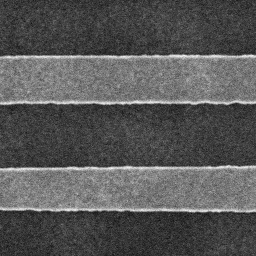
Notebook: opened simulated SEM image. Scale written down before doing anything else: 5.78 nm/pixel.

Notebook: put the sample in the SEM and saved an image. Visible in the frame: lines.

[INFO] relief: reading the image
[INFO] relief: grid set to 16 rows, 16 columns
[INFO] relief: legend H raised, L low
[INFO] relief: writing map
LLLLLLLLLLLLLLLL
LLLLLLLLLLLLLLLL
LLLLLLLLLLLLLLLL
LLLLLLLLLLHHHHLH
HHHHHHHHHHHHHHHH
HHHHHHHHHHHHHHHH
LLLLLLLLLLLLLLLL
LLLLLLLLLLLLLLLL
LLLLLLLLLLLLLLLL
LLLLLLLLLLLLLLLL
LLLLHHHHHHHHHHHH
HHHHHHHHHHHHHHHH
HHHHHHHHHHHHHHHH
LLLLLLLLLLLLLLLL
LLLLLLLLLLLLLLLL
LLLLLLLLLLLLLLLL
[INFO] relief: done